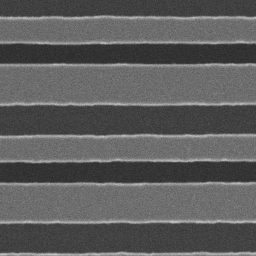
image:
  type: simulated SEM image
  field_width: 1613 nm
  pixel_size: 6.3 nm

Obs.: lines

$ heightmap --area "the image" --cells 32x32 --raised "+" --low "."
................................
................................
++++++++++++++++++++++++++++++++
++++++++++++++++++++++++++++++++
++++++++++++++++++++++++++++++++
................................
................................
................................
++++++++++++++++++++++++++++++++
++++++++++++++++++++++++++++++++
++++++++++++++++++++++++++++++++
++++++++++++++++++++++++++++++++
++++++++++++++++++++++++++++++++
................................
................................
................................
................................
++++++++++++++++++++++++++++++++
++++++++++++++++++++++++++++++++
++++++++++++++++++++++++++++++++
................................
................................
................................
++++++++++++++++++++++++++++++++
++++++++++++++++++++++++++++++++
++++++++++++++++++++++++++++++++
++++++++++++++++++++++++++++++++
++++++++++++++++++++++++++++++++
................................
................................
................................
................................